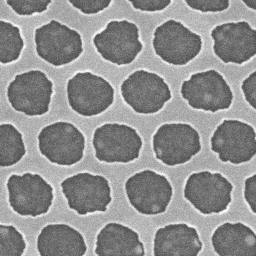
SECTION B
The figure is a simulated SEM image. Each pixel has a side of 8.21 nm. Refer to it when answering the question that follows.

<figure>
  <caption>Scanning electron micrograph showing a regular array of holes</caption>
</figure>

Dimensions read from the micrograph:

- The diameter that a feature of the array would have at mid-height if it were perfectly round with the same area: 372 nm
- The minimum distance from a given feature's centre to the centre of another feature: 460 nm